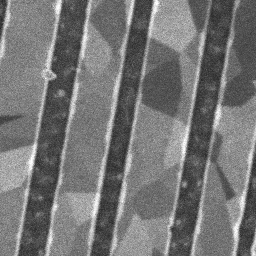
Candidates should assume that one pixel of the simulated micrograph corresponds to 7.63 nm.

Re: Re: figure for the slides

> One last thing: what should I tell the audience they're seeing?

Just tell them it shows one or a few lines or trenches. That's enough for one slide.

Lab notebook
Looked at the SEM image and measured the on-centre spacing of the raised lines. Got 71.6 px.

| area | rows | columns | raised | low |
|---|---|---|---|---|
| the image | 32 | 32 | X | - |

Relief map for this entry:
-XXXXXX----XXXXXX--XXXXXXX---XXX
-XXXXXX----XXXXX---XXXXXXX---XXX
-XXXXXX----XXXXX---XXXXXXX---XXX
-XXXXXX----XXXXX---XXXXXXX---XXX
XXXXXXX----XXXXX---XXXXXX----XXX
XXXXXXX---XXXXXX---XXXXXX----XXX
XXXXXX----XXXXX---XXXXXXX---XXXX
XXXXXX----XXXXX---XXXXXXX---XXXX
XXXXXX----XXXXX---XXXXXXX---XXXX
XXXXXXX---XXXXX---XXXXXXX---XXXX
XXXXXX----XXXXX---XXXXXX----XXXX
XXXXXX---XXXXXX--XXXXXXX----XXXX
XXXXX----XXXXX---XXXXXXX---XXXXX
XXXXX----XXXXX---XXXXXXX---XXXXX
XXXXX----XXXXX---XXXXXXX---XXXXX
XXXXX----XXXXX---XXXXXXX---XXXXX
XXXXX---XXXXXX---XXXXXX----XXXXX
XXXX----XXXXXX--XXXXXXX----XXXXX
XXXX----XXXXX---XXXXXXX---XXXXXX
XXXX----XXXXX---XXXXXXX---XXXXX-
XXXX----XXXXX---XXXXXXX---XXXXX-
XXXX----XXXXX---XXXXXXX---XXXXX-
XXXX---XXXXXX---XXXXXX----XXXXX-
XXX----XXXXX---XXXXXXX---XXXXXX-
XXX----XXXXX---XXXXXXX---XXXXXX-
XXX----XXXXX---XXXXXXX---XXXXX--
XXX----XXXXX---XXXXXXX---XXXXX--
XXX----XXXXX---XXXXXXX---XXXXX--
XXX---XXXXXX--XXXXXXX----XXXXX--
XX----XXXXXX--XXXXXXX---XXXXXX--
XX----XXXXX---XXXXXXX---XXXXX---
XX----XXXXX---XXXXXXX---XXXXX---